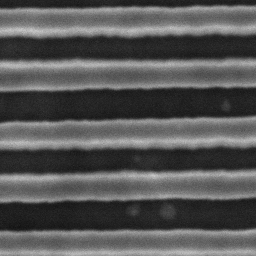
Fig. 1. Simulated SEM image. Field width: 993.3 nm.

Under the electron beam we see lines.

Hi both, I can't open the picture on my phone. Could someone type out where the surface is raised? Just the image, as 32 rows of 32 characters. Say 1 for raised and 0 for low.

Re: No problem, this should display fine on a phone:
00000000000000000000000000000000
11111111111111111111111111111111
11111111111111111111111111111111
11111111111111111111111111111111
00000000000000000000000000000000
00000000000000000000000000000000
00000000000000000000000000000000
00000000000000000000000000000000
11111111111111111111111111111111
11111111111111111111111111111111
11111111111111111111111111111111
00000000000000000000000000000000
00000000000000000000000000000000
00000000000000000000000000000000
00000000000000000000000000000000
11111111111111111111111111111111
11111111111111111111111111111111
11111111111111111111111111111111
00000000000000000000000000000000
00000000000000000000000000000000
00000000000000000000000000000000
00000000000000000000000000000000
11111111111111111111111111111111
11111111111111111111111111111111
11111111111111111111111111111111
00000000000000000000000000000000
00000000000000000000000000000000
00000000000000000000000000000000
00000000000000000000000000000000
11111111111111111111111111111111
11111111111111111111111111111111
11111111111111111111111111111111